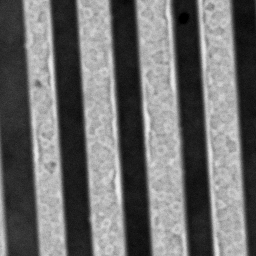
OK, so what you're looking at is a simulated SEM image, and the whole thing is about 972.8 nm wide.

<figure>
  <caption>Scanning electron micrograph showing parallel lines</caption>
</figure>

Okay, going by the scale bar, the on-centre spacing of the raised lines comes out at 224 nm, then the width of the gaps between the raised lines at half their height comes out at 0.0985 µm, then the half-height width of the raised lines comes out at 125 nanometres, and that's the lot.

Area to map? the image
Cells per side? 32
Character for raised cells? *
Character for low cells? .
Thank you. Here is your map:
...***....****...****....****...
...***....****...****....****...
...***....****...*****...****...
...***....****...*****...****...
...***....****...*****...****...
...****...****...*****...****...
...****...****...*****...****...
...****...****...*****...****...
...****...****....****...****...
....***...****....****...****...
....***...****....****...****...
....***...****....****...*****..
....***...****....****...*****..
....***...*****...****....****..
....***....****...****....****..
....***....****...****....****..
....***....****...*****...****..
....***....****...*****...****..
....***....****...*****...****..
....***....****...*****...****..
....****...****...*****...****..
....****...****...*****...****..
....****...****...*****...****..
....****...****....****...****..
.....***...****....****...****..
.....***...****....****...****..
.....***...****....****...****..
.....***...****....****....****.
*....***...*****...****....****.
*....***....****...****....****.
*....***....****...****....****.
*....***....****...****....****.